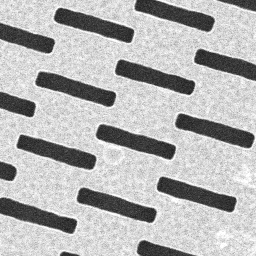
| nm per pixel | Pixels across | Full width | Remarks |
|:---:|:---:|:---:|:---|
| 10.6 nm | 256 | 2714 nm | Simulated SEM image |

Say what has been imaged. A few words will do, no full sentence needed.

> a regular array of holes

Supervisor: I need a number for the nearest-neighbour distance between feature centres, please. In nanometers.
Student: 705